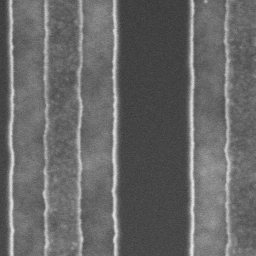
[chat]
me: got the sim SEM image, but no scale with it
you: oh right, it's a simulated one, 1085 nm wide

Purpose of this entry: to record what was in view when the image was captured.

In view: lines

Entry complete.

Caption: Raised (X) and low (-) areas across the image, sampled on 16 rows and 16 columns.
X--XX--XXXXX--XX
X--XX--XXXXX--XX
X--XX--XXXXX--XX
X--XX--XXXXX--XX
X--XX--XXXXX--XX
X--XX--XXXXX--XX
X--XX--XXXXX--XX
X--XX--XXXXX--XX
X--XX--XXXXX--XX
X--XX--XXXXX--XX
X--XX--XXXXX--XX
X--XX--XXXXX--XX
X--XX--XXXXX--XX
X--XX--XXXXX--XX
X--XX--XXXXX--XX
X--XX--XXXXX--XX